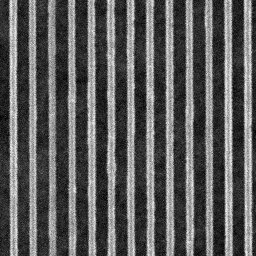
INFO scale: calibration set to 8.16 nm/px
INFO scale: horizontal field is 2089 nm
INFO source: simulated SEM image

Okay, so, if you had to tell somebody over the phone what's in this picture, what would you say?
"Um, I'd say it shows parallel lines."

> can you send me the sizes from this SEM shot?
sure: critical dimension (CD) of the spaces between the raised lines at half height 0.112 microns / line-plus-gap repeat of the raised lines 0.16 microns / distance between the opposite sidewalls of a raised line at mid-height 0.0479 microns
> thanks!